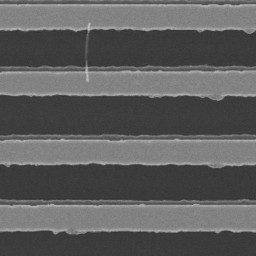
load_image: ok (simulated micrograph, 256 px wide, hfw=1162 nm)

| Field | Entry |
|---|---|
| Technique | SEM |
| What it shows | lines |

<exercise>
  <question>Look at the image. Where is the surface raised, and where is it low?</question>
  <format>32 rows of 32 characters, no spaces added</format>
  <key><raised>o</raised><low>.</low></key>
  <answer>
oooooooooooooooooooooooooooooooo
oooooooooooooooooooooooooooooooo
oooooooooooooooooooooooooooooooo
oooooooooooooooooooooooooooooooo
................................
................................
................................
................................
oooo.ooooooooooooooooooooooooooo
oooooooooooooooooooooooooooooooo
oooooooooooooooooooooooooooooooo
oooooooooooooooooooooooooooooooo
................................
................................
................................
................................
................................
oooooooooooooooooooooooooooooooo
oooooooooooooooooooooooooooooooo
oooooooooooooooooooooooooooooooo
oooooooooo..oo.oooooo.oooooooooo
................................
................................
................................
................................
oooooooooooooooooooooooooooooooo
oooooooooooooooooooooooooooooooo
oooooooooooooooooooooooooooooooo
oooooooooooooooooooooooooooooooo
................................
................................
................................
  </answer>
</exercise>